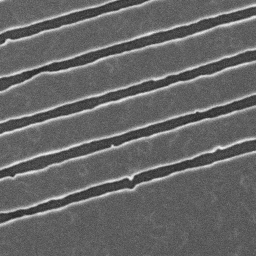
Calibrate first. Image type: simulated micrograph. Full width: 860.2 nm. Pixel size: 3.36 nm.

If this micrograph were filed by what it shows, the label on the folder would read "parallel lines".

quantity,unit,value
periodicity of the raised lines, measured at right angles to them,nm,145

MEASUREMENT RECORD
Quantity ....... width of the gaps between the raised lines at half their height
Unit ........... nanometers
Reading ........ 35.1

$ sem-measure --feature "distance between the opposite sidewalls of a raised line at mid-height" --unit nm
112